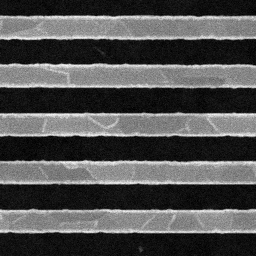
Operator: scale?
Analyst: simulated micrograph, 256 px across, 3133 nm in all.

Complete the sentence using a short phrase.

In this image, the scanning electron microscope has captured lines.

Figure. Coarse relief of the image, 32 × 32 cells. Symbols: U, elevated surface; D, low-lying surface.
DDDDDDDDDDDDDDDDDDDDDDDDDDDDDDDD
DDDDDDDDDDDDDDDDDDDDDDDDDDDDDDDD
UUUUUUUUUUUUUUUUUUUUUUUUUUUUUUUU
UUUUUUUUUUUUUUUUUUUUUUUUUUUUUUUU
UUUUUUUUUUUUUUUUUUUUUUUUUUUUUUUU
DDDDDDDDDDDDDDDDDDDDDDDDDDDDDDDD
DDDDDDDDDDDDDDDDDDDDDDDDDDDDDDDD
DDDDDDDDDDDDDDDDDDDDDDDDDDDDDDDD
UUUUUUUUUUUUUUUUUUUUUUUUUUUUUUUU
UUUUUUUUUUUUUUUUUUUUUUUUUUUUUUUU
UUUUUUUUUUUUUUUUUUUUUUUUUUUUUUUU
DDDDDDDDDDDDDDDDDDDDDDDDDDDDDDDD
DDDDDDDDDDDDDDDDDDDDDDDDDDDDDDDD
DDDDDDDDDDDDDDDDDDDDDDDDDDDDDDDD
UUUUUUUUUUUUUUUUUUUUUUUUUUUUUUUU
UUUUUUUUUUUUUUUUUUUUUUUUUUUUUUUU
UUUUUUUUUUUUUUUUUUUUUUUUUUUUUUUU
DDDDDDDDDDDDDDDDDDDDDDDDDDDDDDDD
DDDDDDDDDDDDDDDDDDDDDDDDDDDDDDDD
DDDDDDDDDDDDDDDDDDDDDDDDDDDDDDDD
UUUUUUUUUUUUUUUUUUUUUUUUUUUUUUUU
UUUUUUUUUUUUUUUUUUUUUUUUUUUUUUUU
UUUUUUUUUUUUUUUUUUUUUUUUUUUUUUUU
DDDDDDDDDDDDDDDDDDDDDDDDDDDDDDDD
DDDDDDDDDDDDDDDDDDDDDDDDDDDDDDDD
DDDDDDDDDDDDDDDDDDDDDDDDDDDDDDDD
UUUUUUUUUUUUUUUUUUUUUUUUUUUUUUUU
UUUUUUUUUUUUUUUUUUUUUUUUUUUUUUUU
UUUUUUUUUUUUUUUUUUUUUUUUUUUUUUUU
DDDDDDDDDDDDDDDDDDDDDDDDDDDDDDDD
DDDDDDDDDDDDDDDDDDDDDDDDDDDDDDDD
DDDDDDDDDDDDDDDDDDDDDDDDDDDDDDDD